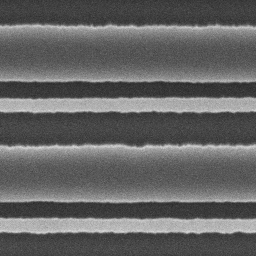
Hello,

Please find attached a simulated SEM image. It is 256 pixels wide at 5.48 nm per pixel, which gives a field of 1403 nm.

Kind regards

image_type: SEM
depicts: lines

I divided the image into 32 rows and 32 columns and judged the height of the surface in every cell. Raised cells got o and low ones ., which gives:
................................
................................
................................
ooooooooooooooooo.oooooooooooooo
oooooooooooooooooooooooooooooooo
oooooooooooooooooooooooooooooooo
oooooooooooooooooooooooooooooooo
oooooooooooooooooooooooooooooooo
oooooooooooooooooooooooooooooooo
oooooooooooooooooooooooooooooooo
................................
................................
oooooooooooooooooooooooooooooooo
oooooooooooooooooooooooooooooooo
................................
................................
................................
................................
ooooooooooooooooo.oooooooooooooo
oooooooooooooooooooooooooooooooo
oooooooooooooooooooooooooooooooo
oooooooooooooooooooooooooooooooo
oooooooooooooooooooooooooooooooo
oooooooooooooooooooooooooooooooo
oooooooooooooooooooooooooooooooo
................................
................................
ooooooooooooooooooooooo.oooooo.o
oooooooooooooooooooooooooooooooo
................................
................................
................................